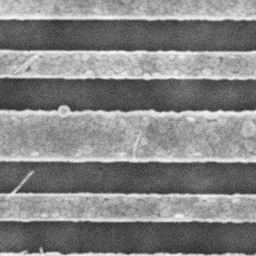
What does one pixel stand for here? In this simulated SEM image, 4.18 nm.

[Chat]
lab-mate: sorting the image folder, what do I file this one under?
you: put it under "lines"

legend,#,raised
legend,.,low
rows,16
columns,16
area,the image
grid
################
................
................
################
################
................
................
################
################
################
................
................
################
################
................
................